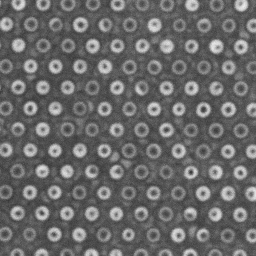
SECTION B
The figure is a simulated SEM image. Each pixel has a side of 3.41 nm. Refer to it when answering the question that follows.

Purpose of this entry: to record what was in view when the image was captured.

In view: a regular array of raised bodies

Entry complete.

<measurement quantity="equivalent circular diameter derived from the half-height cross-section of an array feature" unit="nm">43.8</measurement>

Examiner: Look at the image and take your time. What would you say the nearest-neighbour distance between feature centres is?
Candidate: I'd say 82.1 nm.